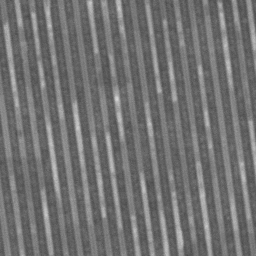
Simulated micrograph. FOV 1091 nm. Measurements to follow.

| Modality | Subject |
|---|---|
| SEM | parallel lines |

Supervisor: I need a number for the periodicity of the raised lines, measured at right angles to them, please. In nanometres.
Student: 61.1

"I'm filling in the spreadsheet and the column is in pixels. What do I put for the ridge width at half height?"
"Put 4.32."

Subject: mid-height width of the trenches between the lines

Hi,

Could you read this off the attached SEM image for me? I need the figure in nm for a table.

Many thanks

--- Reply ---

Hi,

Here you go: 40.2